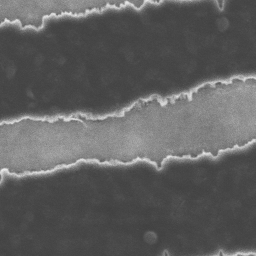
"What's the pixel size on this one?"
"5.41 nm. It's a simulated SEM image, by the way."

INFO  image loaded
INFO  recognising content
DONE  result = one or a few lines or trenches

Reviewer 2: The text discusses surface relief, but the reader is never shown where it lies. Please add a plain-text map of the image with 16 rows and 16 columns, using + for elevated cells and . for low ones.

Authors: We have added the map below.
......++++++++++
+.++++++++++++++
++++++++++++++++
++++++++++++++++
++++++++++++++++
+++++++++++++...
+++++++++.......
+.+.............
................
..............++
...+++++++++++++
++++++++++++++++
++++++++++++++++
++++++++++++++++
++++++++++++++++
++++++++++++++++